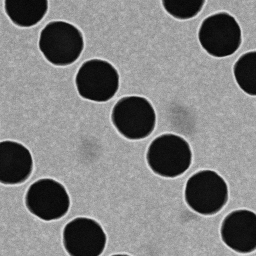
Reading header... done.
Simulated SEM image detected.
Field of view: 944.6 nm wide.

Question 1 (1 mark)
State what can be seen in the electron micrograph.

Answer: holes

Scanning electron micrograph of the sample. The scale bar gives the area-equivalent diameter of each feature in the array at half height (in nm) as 158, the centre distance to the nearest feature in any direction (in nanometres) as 192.